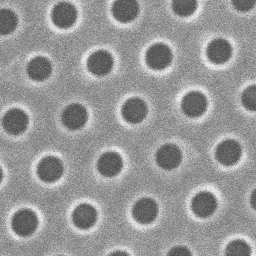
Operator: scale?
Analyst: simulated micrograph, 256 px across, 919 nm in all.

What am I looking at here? a regular array of holes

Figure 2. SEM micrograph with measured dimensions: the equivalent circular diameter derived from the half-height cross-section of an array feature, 102 nanometres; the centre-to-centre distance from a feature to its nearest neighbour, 209 nm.